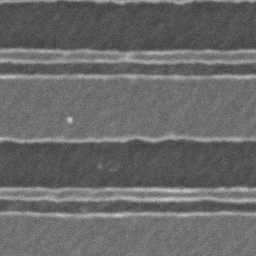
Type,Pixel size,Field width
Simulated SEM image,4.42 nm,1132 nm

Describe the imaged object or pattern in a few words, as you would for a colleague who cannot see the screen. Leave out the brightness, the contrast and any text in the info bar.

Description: lines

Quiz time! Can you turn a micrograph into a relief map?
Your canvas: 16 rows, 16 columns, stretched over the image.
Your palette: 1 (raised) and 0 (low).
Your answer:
0000000000000000
0000000000000000
0000000000000000
1111111111111111
1111111111111111
1111111111111111
1111111111111111
1111111111111111
1111111111111111
0000000000000000
0000000000000000
0000000000000000
1111111111111111
1111111111111111
1111111111111111
1111111111111111